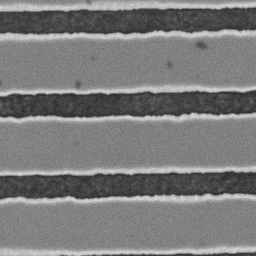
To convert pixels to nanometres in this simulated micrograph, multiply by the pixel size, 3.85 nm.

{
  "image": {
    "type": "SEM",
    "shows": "lines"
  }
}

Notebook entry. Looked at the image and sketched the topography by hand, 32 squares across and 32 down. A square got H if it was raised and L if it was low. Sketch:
HHHHHHHHHHHHHHHHHHHHHHHHHHHHHHHH
LLLLLLLLLLLLLLLLLLLLLLLLLLLLLLLL
LLLLLLLLLLLLLLLLLLLLLLLLLLLLLLLL
LLLLLLLLLLLLLLLLLLLLLLLLLLLLLLLL
HHHHHHHHHHHHHHHHHHHHHHHHHHHHHHHH
HHHHHHHHHHHHHHHHHHHHHHHHHHHHHHHH
HHHHHHHHHHHHHHHHHHHHHHHHHHHHHHHH
HHHHHHHHHHHHHHHHHHHHHHHHHHHHHHHH
HHHHHHHHHHHHHHHHHHHHHHHHHHHHHHHH
HHHHHHHHHHHHHHHHHHHHHHHHHHHHHHHH
HHHHHHHHHHHHHHHHHHHHHHHHHHHHHHHH
HHHHHHHHHHHHHHHHHHLHLLLLLLHLLLHL
LLLLLLLLLLLLLLLLLLLLLLLLLLLLLLLL
LLLLLLLLLLLLLLLLLLLLLLLLLLLLLLLL
LLLLLLLLLLLLLLLLLLLLLLLHHHHHHHHH
HHHHHHHHHHHHHHHHHHHHHHHHHHHHHHHH
HHHHHHHHHHHHHHHHHHHHHHHHHHHHHHHH
HHHHHHHHHHHHHHHHHHHHHHHHHHHHHHHH
HHHHHHHHHHHHHHHHHHHHHHHHHHHHHHHH
HHHHHHHHHHHHHHHHHHHHHHHHHHHHHHHH
HHHHHHHHHHHHHHHHHHHHHHHHHHHHHHHH
HHHHHHHHHHHHHHHHHHHHHHHHHHHHLLHL
LLLLLLLLLLLLLLLLLLLLLLLLLLLLLLLL
LLLLLLLLLLLLLLLLLLLLLLLLLLLLLLLL
LLLLLLLLLLLLLLLLLLLLLLLLLHHLHHHH
HHHHHHHHHHHHHHHHHHHHHHHHHHHHHHHH
HHHHHHHHHHHHHHHHHHHHHHHHHHHHHHHH
HHHHHHHHHHHHHHHHHHHHHHHHHHHHHHHH
HHHHHHHHHHHHHHHHHHHHHHHHHHHHHHHH
HHHHHHHHHHHHHHHHHHHHHHHHHHHHHHHH
HHHHHHHHHHHHHHHHHHHHHHHHHHHHHHHH
HHHHHHHHHHHHHHHHHHHHHHHHHHHHHHHL